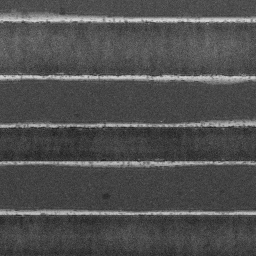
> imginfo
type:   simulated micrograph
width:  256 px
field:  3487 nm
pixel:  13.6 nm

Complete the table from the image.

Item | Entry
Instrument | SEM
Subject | lines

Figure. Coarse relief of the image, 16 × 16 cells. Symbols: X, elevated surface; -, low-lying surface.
XXXXXXXXXXXXXXXX
----------------
----------------
----------------
----------------
XXXXXXXXXXXXXXXX
XXXXXXXXXXXXXXXX
XXXXXXXXXXXXXXXX
----------------
----------------
XXXXXXXXXXXXXXXX
XXXXXXXXXXXXXXXX
XXXXXXXXXXXXXXXX
----------------
----------------
----------------